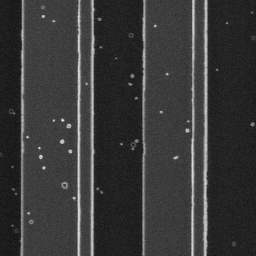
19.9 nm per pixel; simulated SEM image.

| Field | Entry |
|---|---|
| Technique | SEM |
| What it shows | lines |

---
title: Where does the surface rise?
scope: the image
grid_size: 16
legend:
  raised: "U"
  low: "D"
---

DUUUUUDDDUUUUDDD
DUUUUUDDDUUUUDDD
DUUUUUDDDUUUUDDD
DUUUUUDDDUUUUDDD
DUUUUUDDDUUUUDDD
DUUUUUDDDUUUUDDD
DUUUUUDDDUUUUDDD
DUUUUUDDDUUUUDDD
DUUUUUDDDUUUUDDD
DUUUUUDDDUUUUDDD
DUUUUUDDDUUUUDDD
DUUUUUDDDUUUUDDD
DUUUUUDDDUUUUDDD
DUUUUUDDDUUUUDDD
DUUUUUDDDUUUUDDD
DUUUUUDDDUUUUDDD